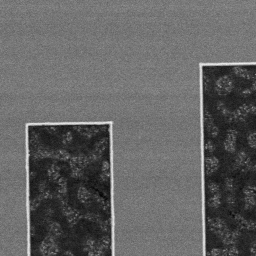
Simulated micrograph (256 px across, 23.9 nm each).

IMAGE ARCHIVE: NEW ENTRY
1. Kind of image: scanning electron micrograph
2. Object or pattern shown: one or a few lines or trenches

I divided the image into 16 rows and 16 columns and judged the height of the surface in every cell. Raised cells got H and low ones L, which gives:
HHHHHHHHHHHHHHHH
HHHHHHHHHHHHHHHH
HHHHHHHHHHHHHHHH
HHHHHHHHHHHHHHHH
HHHHHHHHHHHHHLLL
HHHHHHHHHHHHHLLL
HHHHHHHHHHHHHLLL
HHHHHHHHHHHHHLLL
HHLLLLLHHHHHHLLL
HHLLLLLHHHHHHLLL
HHLLLLLHHHHHHLLL
HHLLLLLHHHHHHLLL
HHLLLLLHHHHHHLLL
HHLLLLLHHHHHHLLL
HHLLLLLHHHHHHLLL
HHLLLLLHHHHHHLLL